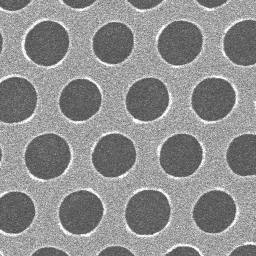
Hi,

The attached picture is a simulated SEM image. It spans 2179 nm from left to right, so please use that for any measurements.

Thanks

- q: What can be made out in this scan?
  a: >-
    a regular array of holes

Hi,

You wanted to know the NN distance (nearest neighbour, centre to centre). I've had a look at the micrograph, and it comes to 0.553 um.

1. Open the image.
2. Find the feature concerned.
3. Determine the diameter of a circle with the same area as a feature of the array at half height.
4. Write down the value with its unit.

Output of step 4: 0.374 um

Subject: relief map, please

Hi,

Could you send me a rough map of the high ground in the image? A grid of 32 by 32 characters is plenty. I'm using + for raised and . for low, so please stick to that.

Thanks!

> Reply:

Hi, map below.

....++++....++++....+++++...++++
++++++++++++++++++++++++++++++++
+++++++++++++++++++++++++++++++.
++++....+++++...+++++....++++...
+++......+++.....+++.....+++....
+++......+++.....+++.....+++....
+++.....++++....++++.....+++....
++++....+++++...+++++...+++++...
++++++++++++++++++++++++++++++++
++++++++++++++++++++++++++++++++
....++++....+++++...+++++....+++
.....+++.....+++.....+++.....+++
.....++......+++.....+++.....+++
....++++....++++.....+++.....+++
....++++....++++....+++++...++++
++++++++++++++++++++++++++++++++
++++++++++++++++++++++++++++++++
++++....++++....+++++....++++...
+++......+++.....+++.....+++....
+++......++......+++.....+++....
+++......+++.....+++.....+++....
++++....++++....+++++...+++++...
++++++++++++++++++++++++++++++++
++++++++++++++++++++++++++++++++
...+++++....+++++....++++....+++
....++++.....+++.....+++.....+++
....+++......+++.....+++.....+++
....+++......+++.....+++.....+++
...+++++....++++....+++++...++++
++++++++++++++++++++++++++++++++
++++++++++++++++++++++++++++++++
++++....+++++...+++++....++++...